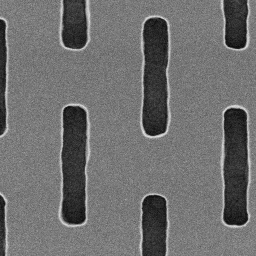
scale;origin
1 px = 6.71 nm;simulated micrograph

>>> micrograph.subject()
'holes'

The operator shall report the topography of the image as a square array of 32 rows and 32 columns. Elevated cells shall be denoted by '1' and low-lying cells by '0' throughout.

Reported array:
11111111000111111111111111110001
11111111000111111111111111110001
11111111000111111100111111110001
01111111000111111100011111110001
01111111000111111100011111110001
01111111000111111100011111110001
01111111111111111100011111111111
01111111111111111100011111111111
01111111111111111100011111111111
01111111111111111100011111111111
01111111111111111100011111111111
01111111111111111100011111111111
01111111111111111100011111111111
01111111001111111100011111111111
01111111000111111100011111110001
01111111000111111100011111110001
01111111000111111100011111110001
11111111000111111111111111110001
11111111000111111111111111110001
11111111000111111111111111110001
11111111000111111111111111110001
11111111000111111111111111110001
11111111000111111111111111110001
11111111000111111111111111110001
11111111000111111100111111110001
01111111000111111100011111110001
01111111000111111100011111110001
01111111000111111100011111110001
01111111111111111100011111111111
01111111111111111100011111111111
01111111111111111100011111111111
01111111111111111100011111111111